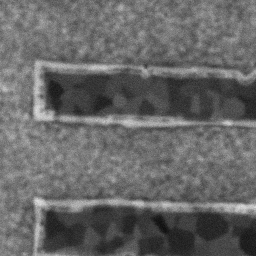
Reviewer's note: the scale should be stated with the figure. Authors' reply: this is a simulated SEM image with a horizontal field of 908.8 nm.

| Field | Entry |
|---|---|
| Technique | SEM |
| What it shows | one or a few lines or trenches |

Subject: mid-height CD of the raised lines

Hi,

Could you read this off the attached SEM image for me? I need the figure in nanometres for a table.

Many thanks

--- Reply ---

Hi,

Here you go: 190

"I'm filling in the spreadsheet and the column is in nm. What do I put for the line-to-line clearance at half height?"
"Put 289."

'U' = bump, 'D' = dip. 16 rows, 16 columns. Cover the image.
DDDDDDDDDDDDDDDD
DDDDDDDDDDDDDDDD
DDDDDDDDDDDDDDDD
DDDDDDDDDDDDDDDD
DDUUUUUUUUUUUUUD
DDUUUUUUUUUUUUUU
DDUUUUUUUUUUUUUU
DDDDDDUUUUUUUUUU
DDDDDDDDDDDDDDDD
DDDDDDDDDDDDDDDD
DDDDDDDDDDDDDDDD
DDDDDDDDDDDDDDDD
DDDDDDDDDDDDDDDD
DDUUUUUUUUUUUUUU
DDUUUUUUUUUUUUUU
DDUUUUUUUUUUUUUU